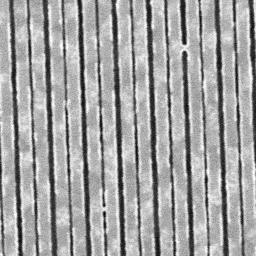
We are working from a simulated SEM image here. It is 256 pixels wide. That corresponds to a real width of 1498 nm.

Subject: parallel lines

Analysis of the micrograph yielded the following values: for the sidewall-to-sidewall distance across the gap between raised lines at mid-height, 29.2 nm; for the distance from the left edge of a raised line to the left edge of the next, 100 nm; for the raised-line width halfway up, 0.0716 microns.